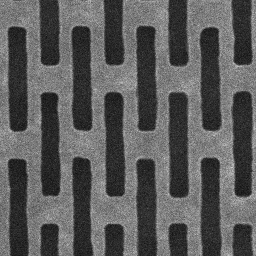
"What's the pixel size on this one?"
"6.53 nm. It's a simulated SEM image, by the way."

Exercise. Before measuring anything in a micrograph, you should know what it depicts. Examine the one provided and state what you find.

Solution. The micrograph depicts a regular array of holes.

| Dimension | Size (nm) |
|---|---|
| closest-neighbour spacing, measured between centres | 418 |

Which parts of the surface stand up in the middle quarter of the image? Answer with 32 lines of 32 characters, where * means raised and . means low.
**.....***********.....****....*
**.....***********.....*********
**.....***********.....*********
**.....***********.....*********
**.....***********.....*********
**.....***********.....*********
**.....***********.....*********
**.....****...****.....***.....*
**.....***.....***.....***.....*
**.....***.....***.....***.....*
**.....***.....***.....***.....*
**.....***.....***.....***.....*
**.....***.....***.....***.....*
**.....***.....***.....***.....*
**.....***.....****....***.....*
***....***.....***.....***.....*
***....***.....****...****.....*
**********.....***********.....*
**********.....***********.....*
**********.....***********.....*
**********.....***********.....*
**********.....***********.....*
**********.....***********.....*
***..*****.....****.******.....*
**.....***.....***.....***.....*
**.....***.....***.....***.....*
**.....***......**.....***.....*
**.....***......**.....***.....*
**.....***......**.....****....*
**.....***......**.....****....*
**.....***.....***.....***.....*
**.....***.....***.....***.....*